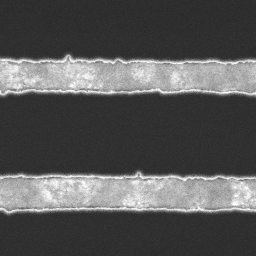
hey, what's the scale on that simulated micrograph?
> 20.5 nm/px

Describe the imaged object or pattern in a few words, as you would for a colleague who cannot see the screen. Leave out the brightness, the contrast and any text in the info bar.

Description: one or a few lines or trenches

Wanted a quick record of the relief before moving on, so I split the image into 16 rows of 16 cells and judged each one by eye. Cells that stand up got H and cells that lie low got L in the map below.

HHHHHHHHHHHHHHHH
HHHHHHHHHHHHHHHH
HHHHHHHHHHHHHHHH
HHHHHHHHHHHHHHHH
LLLLLLLLLLLLLLLL
LLLLLLLLLLLLLLLL
HHHHHHHHHHHHHHHH
HHHHHHHHHHHHHHHH
HHHHHHHHHHHHHHHH
HHHHHHHHHHHHHHHH
HHHHHHHHHHHHHHHH
LLLLLLLLLLLLLLLL
LLLLLLLLLLLLLLLL
HHHHHHHHHHHHHHHH
HHHHHHHHHHHHHHHH
HHHHHHHHHHHHHHHH